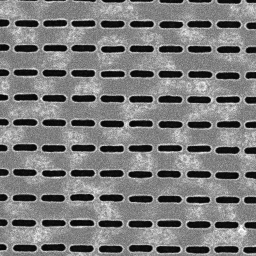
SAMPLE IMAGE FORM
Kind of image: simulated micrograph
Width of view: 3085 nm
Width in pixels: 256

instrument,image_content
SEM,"a regular array of holes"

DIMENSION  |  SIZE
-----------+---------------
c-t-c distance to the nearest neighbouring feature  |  0.297 microns